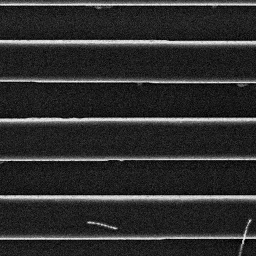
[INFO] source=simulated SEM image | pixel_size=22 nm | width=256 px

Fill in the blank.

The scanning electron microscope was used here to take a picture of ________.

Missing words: lines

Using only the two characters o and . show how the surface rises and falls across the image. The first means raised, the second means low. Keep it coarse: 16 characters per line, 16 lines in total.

................
................
................
oooooooooooooooo
oooooooooooooooo
................
................
oooooooooooooooo
oooooooooooooooo
oooooooooooooooo
................
................
oooooooooooooooo
oooooooooooooooo
oooooooooooooooo
................